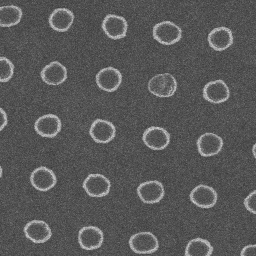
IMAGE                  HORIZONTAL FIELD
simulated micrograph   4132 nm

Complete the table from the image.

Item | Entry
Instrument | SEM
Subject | a regular array of raised bodies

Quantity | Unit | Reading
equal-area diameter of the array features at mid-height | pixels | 23.3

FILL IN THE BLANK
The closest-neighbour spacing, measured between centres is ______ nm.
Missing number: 848